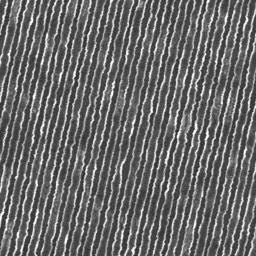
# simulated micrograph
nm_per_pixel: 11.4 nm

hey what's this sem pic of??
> parallel lines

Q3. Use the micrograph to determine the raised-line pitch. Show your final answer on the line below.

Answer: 0.155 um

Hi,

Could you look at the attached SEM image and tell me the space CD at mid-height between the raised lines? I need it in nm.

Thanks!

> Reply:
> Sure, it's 64.2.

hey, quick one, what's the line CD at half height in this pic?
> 92.2 nm